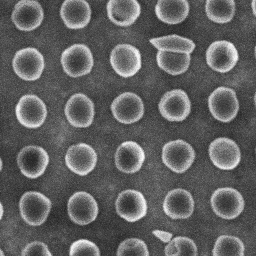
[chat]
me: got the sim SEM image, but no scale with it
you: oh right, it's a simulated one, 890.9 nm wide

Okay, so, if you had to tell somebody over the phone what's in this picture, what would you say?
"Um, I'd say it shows a regular array of raised bodies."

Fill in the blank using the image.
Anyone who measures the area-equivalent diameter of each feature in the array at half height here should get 30.4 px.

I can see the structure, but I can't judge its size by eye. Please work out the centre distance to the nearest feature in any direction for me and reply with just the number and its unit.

47.9 pixels